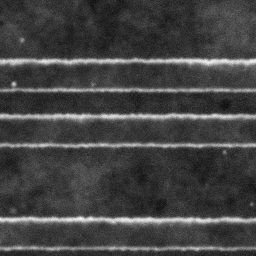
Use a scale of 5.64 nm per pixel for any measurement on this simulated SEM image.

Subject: lines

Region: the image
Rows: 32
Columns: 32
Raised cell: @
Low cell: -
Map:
--------------------------------
--------------------------------
--------------------------------
--------------------------------
--------------------------------
--------------------------------
--------------------------------
--@@--@@-@-@-@@@@@@@@@@@@-------
@@@@@@@@@@@@@@@@@@@@@@@@@@@@@@@@
@@@@@@@@@@@@@@@@@@@@@@@@@@@@@@@@
@@@@@@@@@@@@@@@@@@@@@@@@@@@@@@@@
--------------------------------
--------------------------------
--------------------------------
@@@@@@@@@@@@@@@@@@@@@@@@@@@@@@@@
@@@@@@@@@@@@@@@@@@@@@@@@@@@@@@@@
@@@@@@@@@@@@@@@@@@@@@@@@@@@@@@@@
@@@@@@@@@@@@@@@@@@@@@@@@@@@@@@@@
--------------------------------
--------------------------------
--------------------------------
--------------------------------
--------------------------------
--------------------------------
--------------------------------
--------------------------------
--------------------------------
@@@@@@@@@@@@@@@@@@@@@@@@@@@@@@@@
@@@@@@@@@@@@@@@@@@@@@@@@@@@@@@@@
@@@@@@@@@@@@@@@@@@@@@@@@@@@@@@@@
@@@@@@@@@@@@@@@@@@@@@@@@@@@@@@@@
--------------------------------